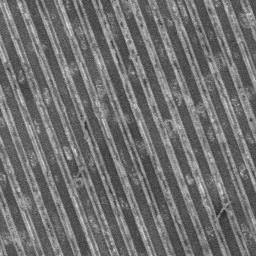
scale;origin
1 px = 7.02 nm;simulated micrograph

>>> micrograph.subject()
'parallel lines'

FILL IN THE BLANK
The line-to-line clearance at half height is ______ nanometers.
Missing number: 78.1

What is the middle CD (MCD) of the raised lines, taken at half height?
45.3 nanometers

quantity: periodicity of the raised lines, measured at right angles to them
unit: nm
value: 123